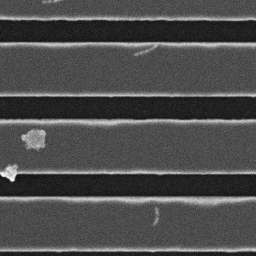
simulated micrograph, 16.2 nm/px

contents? lines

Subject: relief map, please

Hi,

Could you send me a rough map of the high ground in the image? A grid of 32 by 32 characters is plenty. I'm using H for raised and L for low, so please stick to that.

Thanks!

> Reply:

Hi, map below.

HHHHHHHHHHHHHHHHHHHHHHHHHHHHHHHH
HHHHHHHHHHHHHHHHHHHHHHHHHHHHHHHH
LLHLLHLLHHLLLHHLHHHLLHHHHLHHHHHL
LLLLLLLLLLLLLLLLLLLLLLLLLLLLLLLL
LLLLLLLLLLLLLLLLLLLLLLLLLLLLLLLL
HHHHHHHHHHHHHHHHHHHHHHHHHHHHHHHH
HHHHHHHHHHHHHHHHHHHHHHHHHHHHHHHH
HHHHHHHHHHHHHHHHHHHHHHHHHHHHHHHH
HHHHHHHHHHHHHHHHHHHHHHHHHHHHHHHH
HHHHHHHHHHHHHHHHHHHHHHHHHHHHHHHH
HHHHHHHHHHHHHHHHHHHHHHHHHHHHHHHH
HHHHHHHHHHHHHHHHHHHHHHHHHHHHHHHH
LLLLLLLLLLLLLLLLLLLLLLLLLLLLLLLL
LLLLLLLLLLLLLLLLLLLLLLLLLLLLLLLL
LLLLLLLLLLLLLLLLLLLLLLLLLLLLLLLL
HHHHHHHHHHHHHHHHHHHHHHHHHHHHHHHH
HHHHHHHHHHHHHHHHHHHHHHHHHHHHHHHH
HHHHHHHHHHHHHHHHHHHHHHHHHHHHHHHH
HHHHHHHHHHHHHHHHHHHHHHHHHHHHHHHH
HHHHHHHHHHHHHHHHHHHHHHHHHHHHHHHH
HHHHHHHHHHHHHHHHHHHHHHHHHHHHHHHH
HHHHHHHHHHHHHHHHHHHHHHHHHHHHHHHH
LLLLLLLLLLLLLLLLLLLLLLLLLLLLLLLL
LLLLLLLLLLLLLLLLLLLLLLLLLLLLLLLL
LLLLLLLLLLLLLLLLLLLLLLLLLLLLLLLL
HHHHHHHHHHHHHHHHHHHHHHHHHHHHHHHH
HHHHHHHHHHHHHHHHHHHHHHHHHHHHHHHH
HHHHHHHHHHHHHHHHHHHHHHHHHHHHHHHH
HHHHHHHHHHHHHHHHHHHHHHHHHHHHHHHH
HHHHHHHHHHHHHHHHHHHHHHHHHHHHHHHH
HHHHHHHHHHHHHHHHHHHHHHHHHHHHHHHH
LLLLLLLLLLLLLLLLLLLLLLLLLLLLLLLL